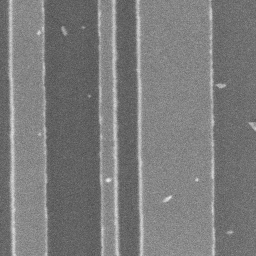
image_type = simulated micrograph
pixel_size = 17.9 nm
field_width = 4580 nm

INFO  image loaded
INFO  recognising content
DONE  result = lines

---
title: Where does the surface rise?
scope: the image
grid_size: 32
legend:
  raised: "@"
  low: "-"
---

-@@@@-------@@---@@@@@@@@@------
-@@@@-------@@---@@@@@@@@@------
-@@@@-------@@---@@@@@@@@@------
-@@@@-------@@---@@@@@@@@@------
-@@@@-------@@---@@@@@@@@@------
-@@@@-------@@---@@@@@@@@@------
-@@@@-------@@@--@@@@@@@@@------
-@@@@-------@@@--@@@@@@@@@------
-@@@@@------@@---@@@@@@@@@------
-@@@@-------@@@--@@@@@@@@@------
-@@@@-------@@@--@@@@@@@@@@-----
-@@@@@------@@@--@@@@@@@@@------
-@@@@@------@@@--@@@@@@@@@@-----
-@@@@@------@@@--@@@@@@@@@@-----
-@@@@@------@@@--@@@@@@@@@@-----
-@@@@@------@@@--@@@@@@@@@@-----
-@@@@@-------@@--@@@@@@@@@@-----
-@@@@@-------@@--@@@@@@@@@@-----
-@@@@@-------@@--@@@@@@@@@@-----
-@@@@@-------@@--@@@@@@@@@@-----
-@@@@@-------@@--@@@@@@@@@@-----
-@@@@@-------@@--@@@@@@@@@@-----
-@@@@@-------@@--@@@@@@@@@@-----
-@@@@@-------@@--@@@@@@@@@@-----
-@@@@@-------@@--@@@@@@@@@@-----
-@@@@@-------@@--@@@@@@@@@@-----
-@@@@@-------@@--@@@@@@@@@@-----
-@@@@@-------@@--@@@@@@@@@@-----
-@@@@@-------@@--@@@@@@@@@@-----
-@@@@@-------@@--@@@@@@@@@@-----
-@@@@@-------@@--@@@@@@@@@@-----
-@@@@@-------@@--@@@@@@@@@@-----